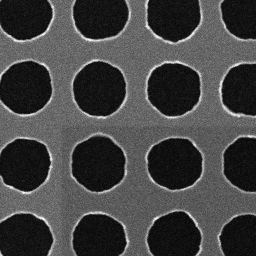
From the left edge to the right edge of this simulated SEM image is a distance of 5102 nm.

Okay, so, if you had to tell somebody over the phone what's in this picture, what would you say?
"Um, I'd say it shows holes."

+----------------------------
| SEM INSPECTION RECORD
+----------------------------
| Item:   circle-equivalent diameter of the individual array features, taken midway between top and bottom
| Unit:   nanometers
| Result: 1080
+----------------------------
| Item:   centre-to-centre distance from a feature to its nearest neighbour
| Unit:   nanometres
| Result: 1480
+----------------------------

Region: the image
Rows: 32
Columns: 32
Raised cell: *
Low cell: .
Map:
......***.......***......***....
.......**.......**.......***....
......***.......**.......***....
......****.....****......***....
*....******...******....*****...
********************************
********************************
********************************
*.....****.....*****....*****...
......***......****......***....
......***.......**.......***....
......***.......**.......***....
......***......****......***....
*....*****.....****.....****....
************.********.**********
********************************
********************************
**..*******...*******...******..
......***......****......***....
......***.......**.......***....
......***.......**.......***....
......***.......***......***....
......****.....****......****...
**...******...*******..*******..
********************************
********************************
**********************.*********
*....*****....******....*****...
......***......****......***....
.......**.......**.......**.....
.......**.......**.......***....
......***......****......***....